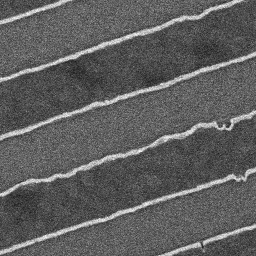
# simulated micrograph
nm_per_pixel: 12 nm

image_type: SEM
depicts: one or a few lines or trenches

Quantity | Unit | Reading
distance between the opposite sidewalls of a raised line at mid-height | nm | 674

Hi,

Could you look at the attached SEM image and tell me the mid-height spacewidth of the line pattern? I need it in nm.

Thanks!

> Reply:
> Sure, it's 640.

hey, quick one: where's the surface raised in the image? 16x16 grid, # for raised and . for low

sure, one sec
###..........###
...........#####
........########
.....###########
..##########....
##########......
######..........
###............#
...........#####
........########
.....###########
.############...
##########......
#######.........
####...........#
#...........####